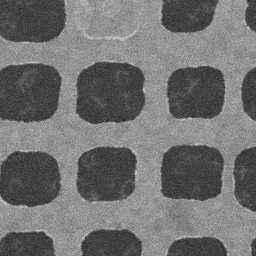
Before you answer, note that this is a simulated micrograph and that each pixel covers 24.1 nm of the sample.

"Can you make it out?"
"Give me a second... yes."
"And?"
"holes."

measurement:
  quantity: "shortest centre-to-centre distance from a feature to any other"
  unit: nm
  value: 1940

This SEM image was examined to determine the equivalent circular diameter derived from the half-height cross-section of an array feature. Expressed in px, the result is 62.7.